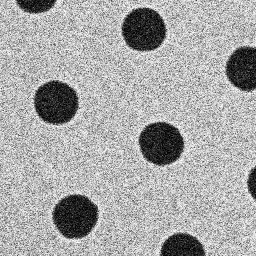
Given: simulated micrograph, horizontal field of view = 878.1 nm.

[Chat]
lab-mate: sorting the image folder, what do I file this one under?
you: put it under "holes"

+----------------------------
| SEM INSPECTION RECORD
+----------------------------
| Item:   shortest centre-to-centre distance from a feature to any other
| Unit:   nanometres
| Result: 387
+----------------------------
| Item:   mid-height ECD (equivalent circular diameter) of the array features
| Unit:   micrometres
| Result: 0.154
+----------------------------